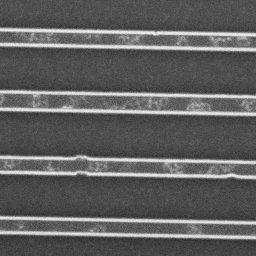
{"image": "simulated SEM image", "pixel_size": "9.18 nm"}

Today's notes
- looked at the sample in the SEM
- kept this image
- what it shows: one or a few lines or trenches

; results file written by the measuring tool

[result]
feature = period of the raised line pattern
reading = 575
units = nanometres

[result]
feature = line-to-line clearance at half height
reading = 431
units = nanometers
